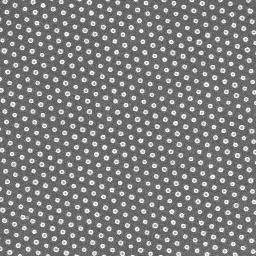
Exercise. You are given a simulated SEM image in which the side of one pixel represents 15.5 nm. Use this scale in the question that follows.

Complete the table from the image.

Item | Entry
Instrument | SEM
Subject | a regular array of raised bodies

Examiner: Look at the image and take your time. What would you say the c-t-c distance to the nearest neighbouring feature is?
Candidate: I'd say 162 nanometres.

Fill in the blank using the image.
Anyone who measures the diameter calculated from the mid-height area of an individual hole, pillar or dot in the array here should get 67.9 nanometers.